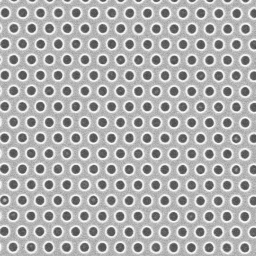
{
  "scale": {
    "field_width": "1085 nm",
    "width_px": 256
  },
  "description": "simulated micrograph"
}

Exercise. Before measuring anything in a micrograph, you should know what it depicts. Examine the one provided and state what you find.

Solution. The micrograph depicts a regular array of holes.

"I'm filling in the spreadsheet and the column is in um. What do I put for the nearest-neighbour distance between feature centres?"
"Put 0.0746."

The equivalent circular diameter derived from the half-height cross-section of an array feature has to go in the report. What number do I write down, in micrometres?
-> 0.0409